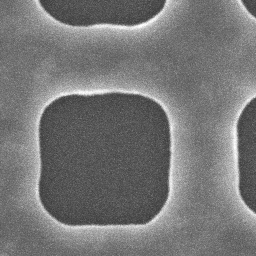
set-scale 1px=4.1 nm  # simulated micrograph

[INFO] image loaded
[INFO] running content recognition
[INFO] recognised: holes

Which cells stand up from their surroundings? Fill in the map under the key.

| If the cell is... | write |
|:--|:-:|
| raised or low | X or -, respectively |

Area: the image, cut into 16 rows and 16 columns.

XXX-------XXXXX-
XXXX-----XXXXXXX
XXXXXXXXXXXXXXXX
XXXXXXXXXXXXXXXX
XXXXXXXXXXXXXXXX
XXXXXXXXXXXXXXXX
XXX-------XXXXX-
XX---------XXXX-
XX---------XXXX-
XX---------XXXX-
XXX--------XXXX-
XX---------XXXX-
XXX-------XXXXX-
XXX-------XXXXXX
XXXXXXXXXXXXXXXX
XXXXXXXXXXXXXXXX